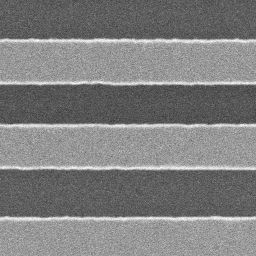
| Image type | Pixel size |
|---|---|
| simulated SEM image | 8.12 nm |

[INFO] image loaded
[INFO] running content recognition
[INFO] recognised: lines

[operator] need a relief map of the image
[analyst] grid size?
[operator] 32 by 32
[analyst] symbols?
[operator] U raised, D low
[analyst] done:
DDDDDDDDDDDDDDDDDDDDDDDDDDDDDDDD
DDDDDDDDDDDDDDDDDDDDDDDDDDDDDDDD
DDDDDDDDDDDDDDDDDDDDDDDDDDDDDDDD
DDDDDDDDDDDDDDDDDDDDDDDDDDDDDDDD
DDDDDDDDDDDDDDDDDDDDDDDDDDDDDDDD
UUUUUUUUUUUUUUUUUUUUUUUUUUUUUUUU
UUUUUUUUUUUUUUUUUUUUUUUUUUUUUUUU
UUUUUUUUUUUUUUUUUUUUUUUUUUUUUUUU
UUUUUUUUUUUUUUUUUUUUUUUUUUUUUUUU
UUUUUUUUUUUUUUUUUUUUUUUUUUUUUUUU
DDDDDUDDDDDDDUUUUUDDDDDUUUUDDDDD
DDDDDDDDDDDDDDDDDDDDDDDDDDDDDDDD
DDDDDDDDDDDDDDDDDDDDDDDDDDDDDDDD
DDDDDDDDDDDDDDDDDDDDDDDDDDDDDDDD
DDDDDDDDDDDDDDDDDDDDDDDDDDDDDDDD
DDDDDDDDDDDDDDDDDDDDDDDDDDDDDDDD
UUUUUUUUUUUUUUUUUUUUUUUUUUUUUUUU
UUUUUUUUUUUUUUUUUUUUUUUUUUUUUUUU
UUUUUUUUUUUUUUUUUUUUUUUUUUUUUUUU
UUUUUUUUUUUUUUUUUUUUUUUUUUUUUUUU
UUUUUUUUUUUUUUUUUUUUUUUUUUUUUUUU
DDDDDDDDDDDDDDDDDDDDDDDDDDDDDDDD
DDDDDDDDDDDDDDDDDDDDDDDDDDDDDDDD
DDDDDDDDDDDDDDDDDDDDDDDDDDDDDDDD
DDDDDDDDDDDDDDDDDDDDDDDDDDDDDDDD
DDDDDDDDDDDDDDDDDDDDDDDDDDDDDDDD
DDDDDDDDDDDDDDDDDDDDDDDDDDDDDDDD
UUUUUUUUUUUUUUUUUUUUUUUUUUUUUUUU
UUUUUUUUUUUUUUUUUUUUUUUUUUUUUUUU
UUUUUUUUUUUUUUUUUUUUUUUUUUUUUUUU
UUUUUUUUUUUUUUUUUUUUUUUUUUUUUUUU
UUUUUUUUUUUUUUUUUUUUUUUUUUUUUUUU